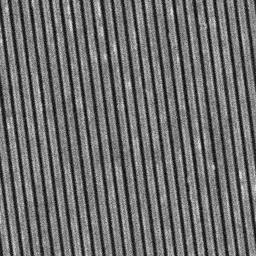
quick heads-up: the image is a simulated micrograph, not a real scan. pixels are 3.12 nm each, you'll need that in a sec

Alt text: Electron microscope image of parallel lines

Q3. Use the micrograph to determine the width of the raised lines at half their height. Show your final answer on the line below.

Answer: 18.2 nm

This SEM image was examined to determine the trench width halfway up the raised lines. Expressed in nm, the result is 12.4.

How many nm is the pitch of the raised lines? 31.8